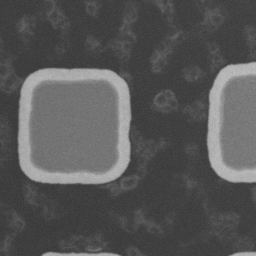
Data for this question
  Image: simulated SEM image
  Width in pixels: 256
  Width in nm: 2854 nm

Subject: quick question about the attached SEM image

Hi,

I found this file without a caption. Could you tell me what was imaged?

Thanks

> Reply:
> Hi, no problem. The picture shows raised bodies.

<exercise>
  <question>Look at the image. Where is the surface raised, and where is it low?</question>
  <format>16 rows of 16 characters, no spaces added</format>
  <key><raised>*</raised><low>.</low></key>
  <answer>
................
................
................
................
..............**
..******......**
..******.....***
.*******.....***
.*******.....***
..******.....***
..*****.......**
................
................
................
................
................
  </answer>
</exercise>